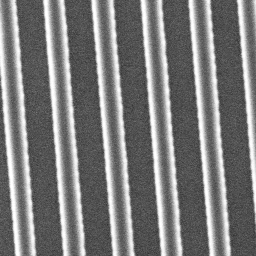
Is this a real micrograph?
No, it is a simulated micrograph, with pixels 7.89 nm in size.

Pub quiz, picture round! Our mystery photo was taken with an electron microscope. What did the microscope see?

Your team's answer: lines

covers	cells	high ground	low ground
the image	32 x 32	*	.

**....**....**....**....**....**
**....**....**....**....**....**
**....**....**....**....**....**
**....**....**....**....**....**
**....**....**....**....**....**
**....**....**....***...***...**
**....**....**....***...***...**
**....***...***...***...***...**
**....***...***...***...***...**
***...***...***...***....**....*
***...***...***....**....**....*
***...***....**....**....**....*
.**....**....**....**....**....*
.**....**....**....**....**....*
.**....**....**....**....**....*
.**....**....**....**....**....*
.**....**....**....**....**....*
.**....**....***...**....***...*
.**....**....***...***...***...*
.**....***...***...***...***...*
.***...***...***...***...***....
.***...***...***....**....**....
.***...***...***....**....**....
.***...***....**....**....**....
.***....**....**....**....**....
..**....**....**....**....**....
..**....**....**....**....**....
..**....**....**....**....**....
..**....**....**....**....**....
..**....**....**....**....***...
..**....**....***...***...***...
..**....**....***...***...***...